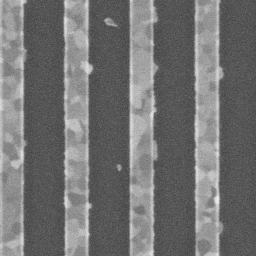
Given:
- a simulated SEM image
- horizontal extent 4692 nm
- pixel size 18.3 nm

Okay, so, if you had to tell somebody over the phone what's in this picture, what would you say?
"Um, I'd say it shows lines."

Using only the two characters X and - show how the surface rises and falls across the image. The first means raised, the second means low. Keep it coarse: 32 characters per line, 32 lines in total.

XXX-----XXX-----XXX------XX-----
XXX-----XXX-----XXX------XX-----
XXX-----XXX-----XXX------XX-----
XXX-----XXX-----XXX------XX-----
XXX-----XXX-----XXX------XX-----
XXX-----XXX-----XXX------XX-----
XXX-----XXX-----XXX------XX-----
XXX-----XXX-----XXX------XX-----
XXX-----XXX-----XXX------XX-----
XXX-----XXX-----XXX------XX-----
XXX-----XXX-----XXX------XX-----
XXX-----XXX-----XXX------XX-----
XXX-----XXX-----XXX------XX-----
XXX-----XXX-----XXX------XX-----
XXX-----XXX-----XXX------XX-----
XXX-----XXX-----XXX------XX-----
XXX-----XXX-----XXX------XX-----
XXX-----XXX-----XXX------XX-----
XXX-----XXX-----XXX------XX-----
XXX-----XXX-----XXX------XX-----
XXX-----XXX-----XXX------XX-----
XXX-----XXX-----XXX------XX-----
XXX-----XXX-----XXX------XX-----
XXX-----XXX-----XXX------XX-----
XXX-----XXX-----XXX------XX-----
XXX-----XXX-----XXX------XX-----
XXX-----XXX-----XXX------XX-----
XXX-----XXX-----XXX------XX-----
XXX-----XXX-----XXX------XX-----
XXX-----XXX-----XXX------XX-----
XXX-----XXX-----XXX------XX-----
XXX-----XXX-----XXX------XX-----